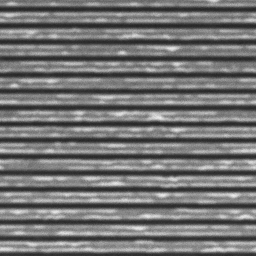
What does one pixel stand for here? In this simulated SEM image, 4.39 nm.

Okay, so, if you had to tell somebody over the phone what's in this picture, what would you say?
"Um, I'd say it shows parallel lines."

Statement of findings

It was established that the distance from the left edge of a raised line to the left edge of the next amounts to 71.8 nm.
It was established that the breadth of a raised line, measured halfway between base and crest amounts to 43.9 nm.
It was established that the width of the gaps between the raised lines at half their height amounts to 26.3 nm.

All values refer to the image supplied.